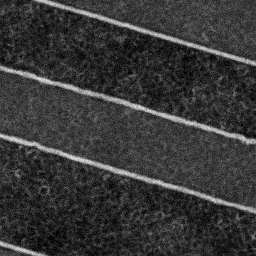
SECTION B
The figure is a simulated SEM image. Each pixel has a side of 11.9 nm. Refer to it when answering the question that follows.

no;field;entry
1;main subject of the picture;one or a few lines or trenches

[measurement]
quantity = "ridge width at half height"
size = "0.901 microns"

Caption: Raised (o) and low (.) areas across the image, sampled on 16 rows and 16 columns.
oooo............
oooooooo........
ooooooooooo.....
oooooooooooooo..
.ooooooooooooooo
.....ooooooooooo
........oooooooo
...........ooooo
...............o
oooo............
ooooooo.........
oooooooooo......
ooooooooooooo...
oooooooooooooooo
oooooooooooooooo
.ooooooooooooooo